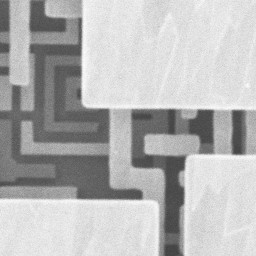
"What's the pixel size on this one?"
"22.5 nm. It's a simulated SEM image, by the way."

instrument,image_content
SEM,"wiring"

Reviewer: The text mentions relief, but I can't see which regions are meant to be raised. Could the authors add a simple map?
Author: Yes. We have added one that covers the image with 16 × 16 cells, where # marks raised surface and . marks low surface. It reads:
.....###########
.....###########
.....###########
.....###########
.....###########
.....###########
.....###########
................
................
................
............####
............####
###.........####
##########..####
##########..####
##########..####